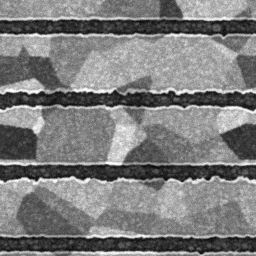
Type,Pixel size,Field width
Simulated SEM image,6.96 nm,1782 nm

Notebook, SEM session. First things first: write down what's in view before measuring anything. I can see one or a few lines or trenches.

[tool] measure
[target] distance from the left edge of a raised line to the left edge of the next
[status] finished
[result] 504 nm